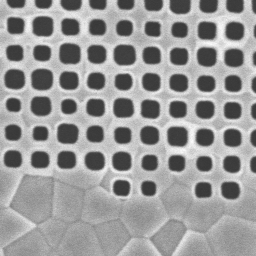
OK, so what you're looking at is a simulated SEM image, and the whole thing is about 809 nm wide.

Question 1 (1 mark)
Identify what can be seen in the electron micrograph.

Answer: a regular array of holes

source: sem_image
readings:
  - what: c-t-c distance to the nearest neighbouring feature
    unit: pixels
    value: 26.4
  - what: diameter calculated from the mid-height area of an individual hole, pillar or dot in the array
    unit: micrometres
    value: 0.0592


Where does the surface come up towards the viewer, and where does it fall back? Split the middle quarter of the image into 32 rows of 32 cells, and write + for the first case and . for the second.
++++++++++++++++++++++++++++++++
++++++++++++++++++++++++++++++++
...++++..++++...++++...+++++.+++
....++....+++....+++....++.....+
....++....+++....++.....++.....+
....++....+++....+++....++.....+
++++++++++++++..+++++..++++....+
++++++++++++++++++++++++++++++++
++++++++++++++++++++++++++++++++
...+++....++.....+++...++++...++
...++.....++.....++.....++.....+
...+++....++......+.....++.....+
++++++....+++....++.....++....++
++++++++++++++++++++...+++++.+++
++++++++++++++++++++++++++++++++
...++++..+++++++++++++++++++++++
....++....+++....++....+++.....+
....++....++.....++.....++.....+
...+++....++.....++.....++.....+
...++++..++++...++++...+++.....+
++++++++++++++++++++++++++++..++
++++++++++++++++++++++++++++++++
...+++...++++...++++++++++++++++
...++.....++.....+++...+++....++
...++.....++.....++....+++....++
...++.....++.....++....+++....++
+++++++..++++...++++...++++...++
++++++++++++++++++++++++++++++++
++++++++++++++++++++++++++++++++
+++++++++++++...++++..++++++++++
++++++++++++.....++....+++++++++
++++++++++++.....++....+++++++++